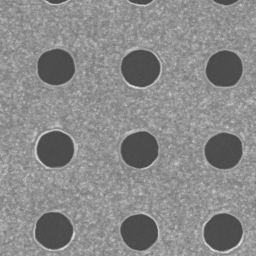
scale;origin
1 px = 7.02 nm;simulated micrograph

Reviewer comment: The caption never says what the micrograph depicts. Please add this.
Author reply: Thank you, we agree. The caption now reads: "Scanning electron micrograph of a regular array of holes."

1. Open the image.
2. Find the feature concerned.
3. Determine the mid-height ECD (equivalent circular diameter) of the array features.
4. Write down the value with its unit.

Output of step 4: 0.263 um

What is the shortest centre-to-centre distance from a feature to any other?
572 nm